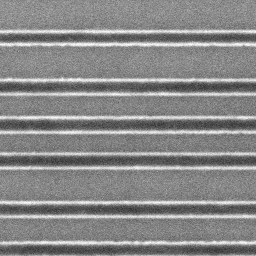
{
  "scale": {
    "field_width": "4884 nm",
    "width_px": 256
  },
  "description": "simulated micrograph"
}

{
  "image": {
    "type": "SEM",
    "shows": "lines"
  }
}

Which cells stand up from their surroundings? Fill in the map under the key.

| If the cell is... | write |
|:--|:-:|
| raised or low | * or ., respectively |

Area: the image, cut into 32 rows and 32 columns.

................................
................................
................................
................................
********************************
********************************
................................
................................
................................
................................
********************************
********************************
................................
................................
................................
********************************
****************.*******..******
................................
................................
********************************
********************************
................................
................................
................................
................................
********************************
********************************
................................
................................
................................
********************************
********************************